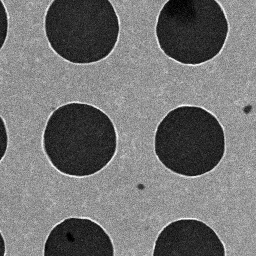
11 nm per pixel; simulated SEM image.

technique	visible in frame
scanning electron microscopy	holes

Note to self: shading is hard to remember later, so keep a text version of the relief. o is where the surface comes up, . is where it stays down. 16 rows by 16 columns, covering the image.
ooo....ooo....oo
ooo....ooo....oo
ooo....ooo....oo
oooo...oooo..ooo
oooooooooooooooo
oooooooooooooooo
oooo.ooooooooooo
ooo....ooo....oo
ooo....ooo....oo
ooo....ooo....oo
oooo..oooo...ooo
oooooooooooooooo
oooooooooooooooo
oooooooooooooooo
ooo....ooo...ooo
ooo....ooo....oo